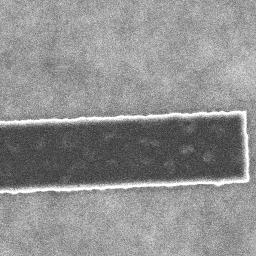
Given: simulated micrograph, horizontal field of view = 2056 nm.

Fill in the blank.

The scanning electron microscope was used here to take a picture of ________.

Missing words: one or a few lines or trenches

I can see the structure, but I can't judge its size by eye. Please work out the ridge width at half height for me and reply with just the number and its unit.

561 nanometres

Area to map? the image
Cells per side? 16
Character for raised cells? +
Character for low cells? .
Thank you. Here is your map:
................
................
................
................
................
................
................
...++++++++++++.
+++++++++++++++.
+++++++++++++++.
+++++++++++++++.
++++++++++++....
................
................
................
................